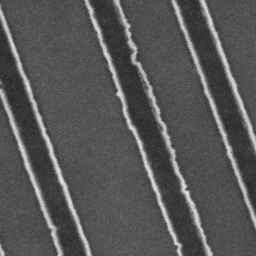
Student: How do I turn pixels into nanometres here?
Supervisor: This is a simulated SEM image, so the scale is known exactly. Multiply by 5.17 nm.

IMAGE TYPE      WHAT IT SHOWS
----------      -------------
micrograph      one or a few lines or trenches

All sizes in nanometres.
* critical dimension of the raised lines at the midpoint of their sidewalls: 144